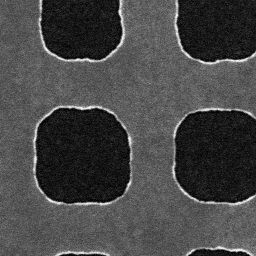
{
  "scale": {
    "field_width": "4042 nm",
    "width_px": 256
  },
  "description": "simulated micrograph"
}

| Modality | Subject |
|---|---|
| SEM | holes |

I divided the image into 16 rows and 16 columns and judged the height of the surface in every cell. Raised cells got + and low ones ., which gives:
+++....++++.....
+++.....+++.....
+++.....+++.....
++++...+++++....
++++++++++++++++
++++++++++++++++
++++++++++++++++
+++....++++.....
++......+++.....
++......+++.....
++......+++.....
++......+++.....
+++....+++++...+
++++++++++++++++
++++++++++++++++
++++++++++++++++